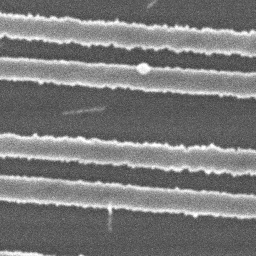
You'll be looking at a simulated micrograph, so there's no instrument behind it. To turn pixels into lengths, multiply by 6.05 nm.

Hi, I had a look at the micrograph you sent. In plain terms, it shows lines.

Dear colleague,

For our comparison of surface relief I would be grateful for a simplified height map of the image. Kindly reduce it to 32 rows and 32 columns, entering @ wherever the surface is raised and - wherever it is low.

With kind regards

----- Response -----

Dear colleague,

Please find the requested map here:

--------------------------------
--------------------------------
@@@@@@@@@@----------------------
@@@@@@@@@@@@@@@@@@@@@@@@--------
-@@@@@@@@@@@@@@@@@@@@@@@@@@@@@@@
----------@@@@@@@@@@@@@@@@@@@@@@
-------------------------@@@@@@@
@@@@----------------------------
@@@@@@@@@@@@@@@@@@@-------------
@@@@@@@@@@@@@@@@@@@@@@@@@@@@@@@@
----------@@@@@@@@@@@@@@@@@@@@@@
----------------------@@@@@@@@@@
--------------------------------
--------------------------------
--------------------------------
--------------------------------
--------------------------------
@@@@@@@@@@@@--------------------
@@@@@@@@@@@@@@@@@@@@@@@-@@@-----
@@@@@@@@@@@@@@@@@@@@@@@@@@@@@@@@
--------------@@@@@@@@@@@@@@@@@@
--------------------------@@@@@@
@@@@@@@@------------------------
@@@@@@@@@@@@@@@@@@@-------------
@@@@@@@@@@@@@@@@@@@@@@@@@@@@@@@@
-------@@@@@@@@@@@@@@@@@@@@@@@@@
---------------------@@@@@@@@@@@
--------------------------------
--------------------------------
--------------------------------
--------------------------------
--------------------------------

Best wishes